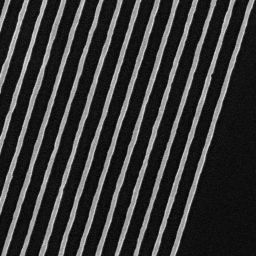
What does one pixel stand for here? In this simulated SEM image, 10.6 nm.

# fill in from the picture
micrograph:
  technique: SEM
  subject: parallel lines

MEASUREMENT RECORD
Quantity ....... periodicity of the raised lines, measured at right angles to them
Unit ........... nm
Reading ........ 190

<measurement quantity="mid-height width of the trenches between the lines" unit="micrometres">0.142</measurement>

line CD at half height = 40.5 nanometres